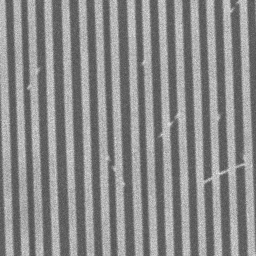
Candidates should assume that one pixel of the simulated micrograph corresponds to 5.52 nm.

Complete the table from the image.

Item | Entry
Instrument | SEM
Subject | parallel lines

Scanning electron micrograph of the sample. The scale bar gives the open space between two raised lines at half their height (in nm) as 49.6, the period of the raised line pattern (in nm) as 88.9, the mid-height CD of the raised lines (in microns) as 0.04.